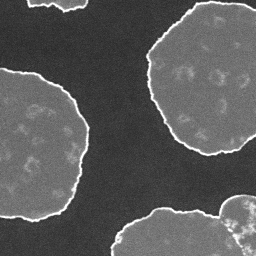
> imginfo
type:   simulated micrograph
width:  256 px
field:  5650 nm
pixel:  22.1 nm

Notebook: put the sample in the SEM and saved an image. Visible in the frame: raised bodies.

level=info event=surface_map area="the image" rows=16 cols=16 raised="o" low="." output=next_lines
....o.......oooo
...........ooooo
..........oooooo
.........ooooooo
o........ooooooo
oooo.....ooooooo
ooooo.....oooooo
ooooo.....oooooo
oooooo.....ooooo
ooooo.......oo..
ooooo...........
ooooo...........
oooo..........oo
ooo......ooooooo
........oooooooo
.......ooooooooo